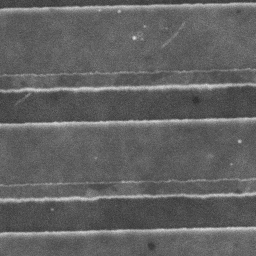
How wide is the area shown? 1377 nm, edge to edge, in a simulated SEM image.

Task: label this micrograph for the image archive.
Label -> lines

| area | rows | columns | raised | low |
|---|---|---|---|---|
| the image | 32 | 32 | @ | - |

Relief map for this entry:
----------------------------@@@@
@@@@@@@@@@@@@@@@@@@@@@@@@@@@@@@@
@@@@@@@@@@@@@@@@@@@@@@@@@@@@@@@@
@@@@@@@@@@@@@@@@@@@@@@@@@@@@@@@@
@@@@@@@@@@@@@@@@@@@@@@@@@@@@@@@@
@@@@@@@@@@@@@@@@@@@@@@@@@@@@@@@@
@@@@@@@@@@@@@@@@@@@@@@@@@@@@@@@@
@@@@@@@@@@@@@@@@@@@@@@@@@@@@@@@@
@@@@@@@@@@@@@@@@@@@@@@@@@@@@@@@@
@@@@@@@@@@@@@@@@@@@@@@@@@@@@@@@@
@@@@@@@@@@@@@@@@@@@@@@@@@@@@@@@-
--------------------------------
--------------------------------
--------------------------------
--------------------------------
---@@@@@@@@@@@@@@@@@@@@@@@@@@@@@
@@@@@@@@@@@@@@@@@@@@@@@@@@@@@@@@
@@@@@@@@@@@@@@@@@@@@@@@@@@@@@@@@
@@@@@@@@@@@@@@@@@@@@@@@@@@@@@@@@
@@@@@@@@@@@@@@@@@@@@@@@@@@@@@@@@
@@@@@@@@@@@@@@@@@@@@@@@@@@@@@@@@
@@@@@@@@@@@@@@@@@@@@@@@@@@@@@@@@
@@@@@@@@@@@@@@@@@@@@@@@@@@@@@@@@
@@@@@@@@@@@@@@@@@@@@@@@@@@@@@@@@
@@@@@@@@@@@@@@@@@---------------
--------------------------------
--------------------------------
--------------------------------
----------------------------@@-@
@@@@@@@@@@@@@@@@@@@@@@@@@@@@@@@@
@@@@@@@@@@@@@@@@@@@@@@@@@@@@@@@@
@@@@@@@@@@@@@@@@@@@@@@@@@@@@@@@@